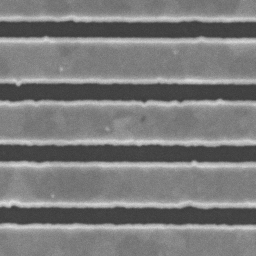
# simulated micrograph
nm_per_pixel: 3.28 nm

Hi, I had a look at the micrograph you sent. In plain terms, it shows one or a few lines or trenches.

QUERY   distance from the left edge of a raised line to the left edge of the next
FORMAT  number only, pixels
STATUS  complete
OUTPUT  61.9